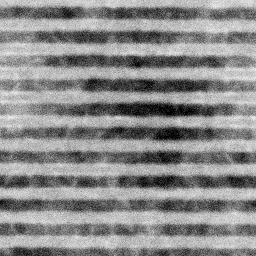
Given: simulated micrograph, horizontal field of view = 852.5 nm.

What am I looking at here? parallel lines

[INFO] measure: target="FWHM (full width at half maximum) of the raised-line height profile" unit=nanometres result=50.8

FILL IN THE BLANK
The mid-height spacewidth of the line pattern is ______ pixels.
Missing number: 8.77